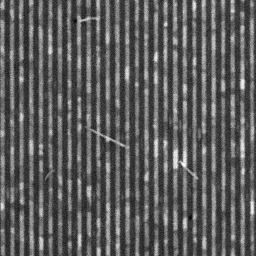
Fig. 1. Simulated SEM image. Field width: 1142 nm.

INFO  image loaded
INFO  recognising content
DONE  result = parallel lines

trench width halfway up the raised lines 27.3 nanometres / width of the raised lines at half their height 13.4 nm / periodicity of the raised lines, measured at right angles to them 42.8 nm